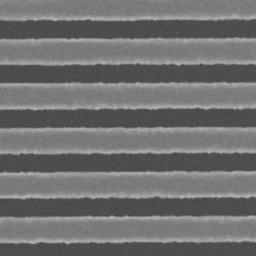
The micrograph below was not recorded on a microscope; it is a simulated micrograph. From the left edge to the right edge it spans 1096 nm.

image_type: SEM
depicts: lines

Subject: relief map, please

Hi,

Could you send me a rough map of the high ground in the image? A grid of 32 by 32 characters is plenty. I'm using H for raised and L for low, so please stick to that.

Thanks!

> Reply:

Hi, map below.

HHHHHHHHHHHHHHHHHHHHHHHHHHHHHHHH
HHHHHHHHHHHHHHHHHHHHHHHHHHHHHHHH
LLLLLLLLLLLLLLLLLLLLLLLLLLLLLLLL
LLLLLLLLLLLLLLLLLLLLLLLLLLLLLLLL
LLLLLLLLLLLLLLLLLLLLLLLLLLLLLLLL
HHHHHHHHHHHHHHHHHHHHHHHHHHHHHHHH
HHHHHHHHHHHHHHHHHHHHHHHHHHHHHHHH
HHHHHHHHHHHHHHHHHHHHHHHHHHHHHHHH
LLLLLLLLLLLLLLLLLLLLLLLLLLLLLLLL
LLLLLLLLLLLLLLLLLLLLLLLLLLLLLLLL
LLHHLLLLLLLLHLLLLHLLLHLLLLLHHLHH
HHHHHHHHHHHHHHHHHHHHHHHHHHHHHHHH
HHHHHHHHHHHHHHHHHHHHHHHHHHHHHHHH
HHHHHHHHHHLHLLLLHLHHLLLLLHLLLLLL
LLLLLLLLLLLLLLLLLLLLLLLLLLLLLLLL
LLLLLLLLLLLLLLLLLLLLLLLLLLLLLLLL
HHHHHHHHHHHHHHHHHHHHHHHHHHHHHHHH
HHHHHHHHHHHHHHHHHHHHHHHHHHHHHHHH
HHHHHHHHHHHHHHHHHHHHHHHHHHHHHHHH
LLLLLLLLLLLLLLLLLLLLLLLLLLLLLLLL
LLLLLLLLLLLLLLLLLLLLLLLLLLLLLLLL
LLLLLLLLLLLLLLLLLLLLLLLLLLLLLLLL
HHHHHHHHHHHHHHHHHHHHHHHHHHHHHHHH
HHHHHHHHHHHHHHHHHHHHHHHHHHHHHHHH
HHHHHHHHHHHHHHHHHHHLHHHHHHHHHHHH
LLLLLLLLLLLLLLLLLLLLLLLLLLLLLLLL
LLLLLLLLLLLLLLLLLLLLLLLLLLLLLLLL
HHHHHHHHHHHHHHHHHHHHHHHHHHHHHHHH
HHHHHHHHHHHHHHHHHHHHHHHHHHHHHHHH
HHHHHHHHHHHHHHHHHHHHHHHHHHHHHHHH
LLLLLLLLLLLLLLLLLLLLLLLLLLLLLLLL
LLLLLLLLLLLLLLLLLLLLLLLLLLLLLLLL